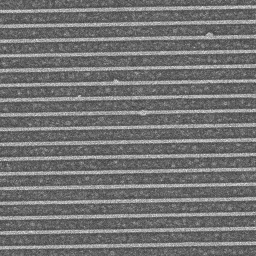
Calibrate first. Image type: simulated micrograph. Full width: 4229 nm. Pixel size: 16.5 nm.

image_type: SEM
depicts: parallel lines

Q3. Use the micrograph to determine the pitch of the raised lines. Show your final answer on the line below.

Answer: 14.8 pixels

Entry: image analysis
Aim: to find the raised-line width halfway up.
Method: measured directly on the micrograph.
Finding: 0.0454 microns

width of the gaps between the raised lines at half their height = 11.5 px